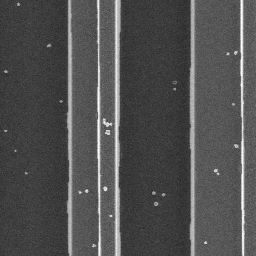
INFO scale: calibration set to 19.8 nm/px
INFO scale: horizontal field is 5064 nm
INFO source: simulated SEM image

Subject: lines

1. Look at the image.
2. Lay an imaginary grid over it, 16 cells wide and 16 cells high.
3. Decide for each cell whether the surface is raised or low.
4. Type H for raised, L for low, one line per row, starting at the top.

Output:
LLLLHHHLLLLLHHHH
LLLLHHHLLLLLHHHH
LLLLHHHLLLLLHHHH
LLLLHHHLLLLLHHHH
LLLLHHHLLLLLHHHH
LLLLHHHLLLLLHHHH
LLLLHHHLLLLLHHHH
LLLLHHHLLLLLHHHH
LLLLHHHLLLLLHHHH
LLLLHHHLLLLLHHHH
LLLLHHHLLLLLHHHH
LLLLHHHLLLLLHHHH
LLLLHHHLLLLLHHHH
LLLLHHHLLLLLHHHH
LLLLHHHLLLLLHHHH
LLLLHHHLLLLLHHHH